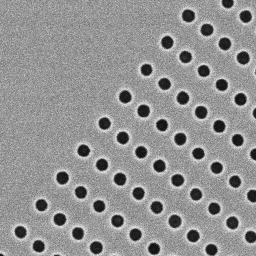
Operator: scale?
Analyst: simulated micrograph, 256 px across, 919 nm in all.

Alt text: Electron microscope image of a regular array of holes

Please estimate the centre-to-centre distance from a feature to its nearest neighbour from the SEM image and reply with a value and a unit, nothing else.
82.8 nm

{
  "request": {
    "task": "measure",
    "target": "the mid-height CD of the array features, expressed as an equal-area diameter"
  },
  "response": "45.5 nm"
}